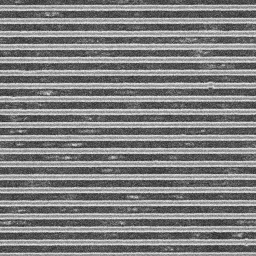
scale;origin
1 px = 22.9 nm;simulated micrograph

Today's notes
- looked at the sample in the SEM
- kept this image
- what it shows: parallel lines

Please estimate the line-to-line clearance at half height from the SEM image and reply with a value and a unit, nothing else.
0.195 micrometres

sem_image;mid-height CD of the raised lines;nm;106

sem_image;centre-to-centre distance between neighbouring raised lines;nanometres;299